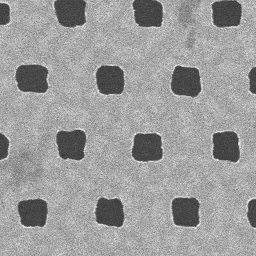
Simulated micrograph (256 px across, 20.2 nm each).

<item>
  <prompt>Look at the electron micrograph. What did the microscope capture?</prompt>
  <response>a regular array of holes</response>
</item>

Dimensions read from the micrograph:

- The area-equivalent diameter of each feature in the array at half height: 626 nanometers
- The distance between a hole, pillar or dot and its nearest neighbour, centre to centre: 75.4 px